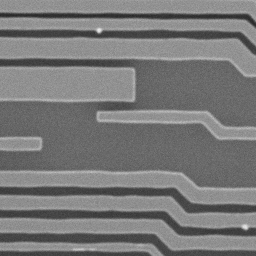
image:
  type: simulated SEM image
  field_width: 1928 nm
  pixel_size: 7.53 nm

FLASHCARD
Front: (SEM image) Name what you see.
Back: groups of lines, slits or small figures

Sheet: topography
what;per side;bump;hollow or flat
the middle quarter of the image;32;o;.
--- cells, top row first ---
................................
ooooooooooooooooo...............
ooooooooooooooooo...............
ooooooooooooooooo...............
ooooooooooooooooo...............
ooooooooooooooooo...............
ooooooooooooooooo...............
ooooooooooooooooo...............
ooooooooooooooooo...............
................................
................................
................................
........oooooooooooooooooooooooo
........oooooooooooooooooooooooo
........................ooooooo.
................................
................................
................................
................................
................................
................................
................................
................................
................................
................................
................................
................................
oooooooooooooooooooooooooooooo..
ooooooooooooooooooooooooooooooo.
oooooooooooooooooooooooooooooooo
...ooooooooooooooooooooooooooooo
.............................ooo